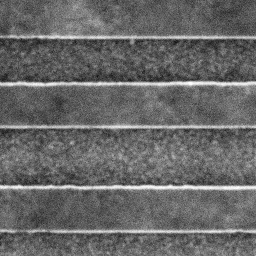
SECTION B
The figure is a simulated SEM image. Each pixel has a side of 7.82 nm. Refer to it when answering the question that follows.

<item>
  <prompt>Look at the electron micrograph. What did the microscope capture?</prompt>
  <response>lines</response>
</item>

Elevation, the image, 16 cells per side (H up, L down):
HHHHHHHHHHHHHHHH
HHHHHHHHHHHHHHHH
LLLLLLLLLLLLLLLL
LLLLLLLLLLLLLLLL
LLLLLLLLLLLLLLLL
HHHHHHHHHHHHHHHH
HHHHHHHHHHHHHHHH
HHHHHHHHHHHHHHHH
LLLLLLLLLLLLLLLL
LLLLLLLLLLLLLLLL
LLLLLLLLLLLLLLLL
LLLLLLLLLLLLLLLL
HHHHHHHHHHHHHHHH
HHHHHHHHHHHHHHHH
LLLLLLLLLLLLLLLL
LLLLLLLLLLLLLLLL